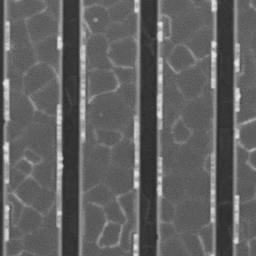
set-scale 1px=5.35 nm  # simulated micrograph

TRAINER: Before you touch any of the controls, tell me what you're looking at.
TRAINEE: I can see one or a few lines or trenches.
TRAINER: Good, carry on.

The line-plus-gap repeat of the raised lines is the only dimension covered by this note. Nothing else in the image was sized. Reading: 412 nanometres